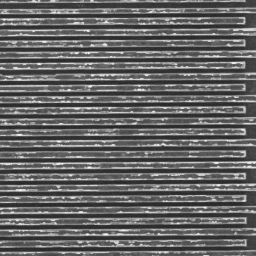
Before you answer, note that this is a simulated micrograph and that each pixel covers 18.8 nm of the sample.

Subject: parallel lines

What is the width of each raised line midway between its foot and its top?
0.127 um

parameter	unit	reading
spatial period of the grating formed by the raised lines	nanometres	208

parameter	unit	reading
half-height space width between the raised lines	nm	89.2